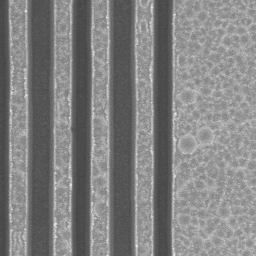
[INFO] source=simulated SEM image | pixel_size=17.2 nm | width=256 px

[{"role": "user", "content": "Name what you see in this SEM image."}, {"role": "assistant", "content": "parallel lines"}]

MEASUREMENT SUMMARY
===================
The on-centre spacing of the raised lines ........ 722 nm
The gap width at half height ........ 0.342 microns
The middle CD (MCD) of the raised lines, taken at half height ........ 350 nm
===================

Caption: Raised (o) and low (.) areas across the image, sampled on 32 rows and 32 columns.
.ooo...oo..ooo...oo...oooooooooo
.ooo...oo..ooo...oo..ooooooooooo
.oo....oo..ooo...oo..ooooooooooo
.oo....oo..ooo...oo..ooooooooooo
.oo....oo..ooo...oo..ooooooooooo
.oo....oo..ooo...oo..ooooooooooo
.ooo...oo..ooo...oo..ooooooooooo
.ooo...oo..ooo...oo..ooooooooooo
.ooo...oo..ooo...oo..ooooooooooo
.oo....oo..ooo...oo..ooooooooooo
.oo....oo..ooo...oo...oooooooooo
.ooo...oo..ooo...oo...oooooooooo
.ooo...oo..ooo...oo..ooooooooooo
.ooo...oo..ooo...oo..ooooooooooo
.ooo...oo..ooo...oo..ooooooooooo
.ooo...oo..ooo...oo..ooooooooooo
.ooo...oo..ooo...oo..ooooooooooo
.ooo...oo..ooo...oo..ooooooooooo
.ooo...oo..ooo...oo..ooooooooooo
.ooo...oo..ooo...oo...oooooooooo
.ooo...oo..ooo...oo...oooooooooo
.ooo...oo..ooo...oo...oooooooooo
.ooo...oo..ooo...oo...oooooooooo
.ooo...oo..ooo...oo..ooooooooooo
.ooo...oo..ooo...oo..ooooooooooo
.ooo...oo..ooo...oo..ooooooooooo
.ooo...oo..ooo...oo..ooooooooooo
.ooo...oo..ooo...oo..ooooooooooo
.oo....oo..ooo...oo..ooooooooooo
.oo....oo..ooo...oo..ooooooooooo
.oo....oo..ooo...oo..ooooooooooo
.oo....oo..ooo...oo..ooooooooooo